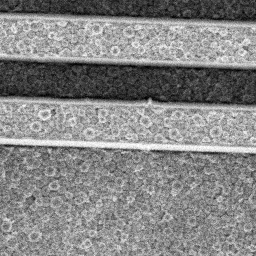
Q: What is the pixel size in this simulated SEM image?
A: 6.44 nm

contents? one or a few lines or trenches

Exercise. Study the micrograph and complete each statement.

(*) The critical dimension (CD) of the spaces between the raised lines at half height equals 0.257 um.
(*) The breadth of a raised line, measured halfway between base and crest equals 283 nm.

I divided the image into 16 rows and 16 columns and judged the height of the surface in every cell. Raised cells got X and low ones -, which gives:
----------------
XXXXXXXXXXXXXXXX
XXXXXXXXXXXXXXXX
XXXXXXXXXXXXXXXX
----------------
----------------
XXXXXXXXXX------
XXXXXXXXXXXXXXXX
XXXXXXXXXXXXXXXX
----------------
----------------
----------------
----------------
----------------
----------------
----------------